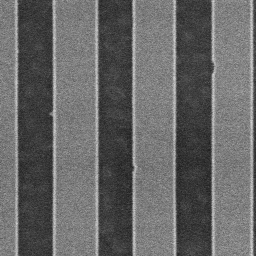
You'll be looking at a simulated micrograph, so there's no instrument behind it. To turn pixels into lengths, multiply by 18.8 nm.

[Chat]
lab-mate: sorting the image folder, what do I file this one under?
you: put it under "one or a few lines or trenches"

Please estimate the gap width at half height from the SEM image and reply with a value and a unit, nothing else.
710 nm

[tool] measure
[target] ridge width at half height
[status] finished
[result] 766 nm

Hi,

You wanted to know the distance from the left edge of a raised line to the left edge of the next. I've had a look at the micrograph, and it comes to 1470 nanometers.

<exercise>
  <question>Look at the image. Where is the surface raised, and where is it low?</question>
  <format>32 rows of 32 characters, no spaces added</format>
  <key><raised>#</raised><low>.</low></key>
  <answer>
##.....#####.....#####.....####.
##.....#####.....#####.....####.
##.....#####.....#####.....####.
##.....#####.....#####.....####.
##.....#####.....#####.....####.
##.....#####.....#####.....####.
##.....#####.....#####.....####.
##.....#####.....#####.....####.
##.....#####.....#####.....####.
##.....#####.....#####.....####.
##.....#####.....#####.....####.
##.....#####.....#####.....####.
##.....#####.....#####.....####.
##.....#####.....#####.....####.
##.....#####.....#####.....####.
##.....#####.....#####.....####.
##.....#####.....#####.....####.
##.....#####.....#####.....####.
##.....#####.....#####.....####.
##.....#####.....#####.....####.
##.....#####.....#####.....####.
##.....#####.....#####.....####.
##.....#####.....#####.....####.
##.....#####.....#####.....####.
##.....#####.....#####.....####.
##.....#####.....#####.....####.
##.....#####.....#####.....####.
##.....#####.....#####.....####.
##.....#####.....#####.....####.
##.....#####.....#####.....####.
##.....#####.....#####.....####.
##.....#####.....#####.....####.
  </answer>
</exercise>